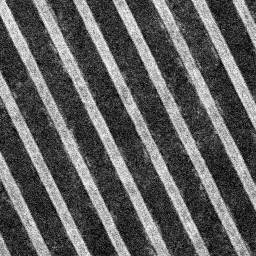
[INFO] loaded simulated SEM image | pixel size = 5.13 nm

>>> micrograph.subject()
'parallel lines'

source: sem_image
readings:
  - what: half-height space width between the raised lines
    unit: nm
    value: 141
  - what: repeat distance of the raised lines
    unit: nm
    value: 184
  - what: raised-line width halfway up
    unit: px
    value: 8.54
